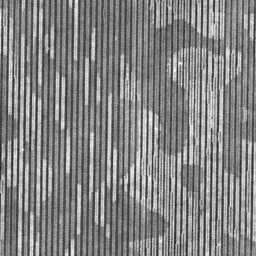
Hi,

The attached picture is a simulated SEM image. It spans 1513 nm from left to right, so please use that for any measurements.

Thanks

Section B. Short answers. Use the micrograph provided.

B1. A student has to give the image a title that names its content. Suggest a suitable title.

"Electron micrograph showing parallel lines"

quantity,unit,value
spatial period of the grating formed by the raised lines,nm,34.7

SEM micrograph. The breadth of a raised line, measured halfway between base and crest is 0.0177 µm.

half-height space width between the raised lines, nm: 17